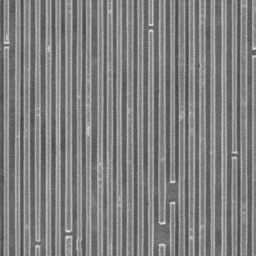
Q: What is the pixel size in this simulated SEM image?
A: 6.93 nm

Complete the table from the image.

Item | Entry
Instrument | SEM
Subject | parallel lines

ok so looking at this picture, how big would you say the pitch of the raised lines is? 71.5 nm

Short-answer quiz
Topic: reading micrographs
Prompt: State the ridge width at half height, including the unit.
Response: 31.2 nanometers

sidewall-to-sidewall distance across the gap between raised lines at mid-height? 0.0372 µm